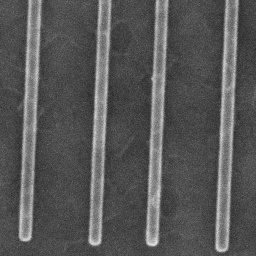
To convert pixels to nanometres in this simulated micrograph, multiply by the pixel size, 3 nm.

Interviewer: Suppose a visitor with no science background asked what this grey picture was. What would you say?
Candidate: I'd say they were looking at parallel lines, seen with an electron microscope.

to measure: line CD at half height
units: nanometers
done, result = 33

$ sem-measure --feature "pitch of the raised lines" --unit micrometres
0.197